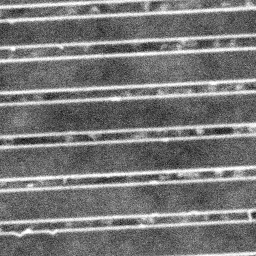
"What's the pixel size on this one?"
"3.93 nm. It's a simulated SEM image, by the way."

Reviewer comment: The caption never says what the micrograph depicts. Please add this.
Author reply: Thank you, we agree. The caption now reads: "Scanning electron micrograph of parallel lines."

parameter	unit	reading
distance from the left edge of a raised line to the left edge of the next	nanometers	169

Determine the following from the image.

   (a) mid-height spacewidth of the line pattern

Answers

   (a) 9.62 pixels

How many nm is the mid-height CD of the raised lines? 131